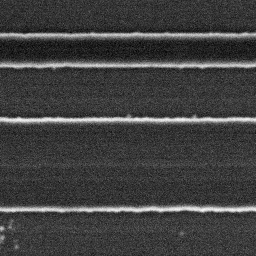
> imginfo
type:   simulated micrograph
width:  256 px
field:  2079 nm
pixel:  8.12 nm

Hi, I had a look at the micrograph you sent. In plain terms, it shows lines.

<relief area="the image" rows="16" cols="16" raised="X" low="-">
----------------
----------------
XXXXXXXXXXXXXXXX
XXXXXXXXXXXXXXXX
----------------
----------------
----------------
XXXXXXXXXXXXXXXX
XXXXXXXXXXXXXXXX
XXXXXXXXXXXXXXXX
XXXXXXXXXXXXXXXX
XXXXXXXXXXXXXXXX
XXXXXXXXXXXXXXXX
----------------
----------------
----------------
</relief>